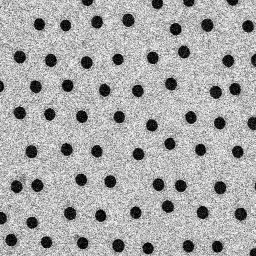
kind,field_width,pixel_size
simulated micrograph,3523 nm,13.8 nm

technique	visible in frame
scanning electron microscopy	a regular array of holes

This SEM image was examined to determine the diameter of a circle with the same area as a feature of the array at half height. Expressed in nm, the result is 165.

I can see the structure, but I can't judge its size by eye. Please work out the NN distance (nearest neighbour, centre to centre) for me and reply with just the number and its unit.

412 nm